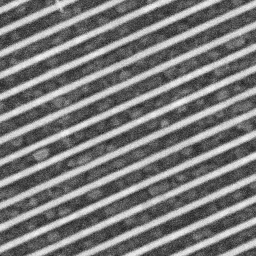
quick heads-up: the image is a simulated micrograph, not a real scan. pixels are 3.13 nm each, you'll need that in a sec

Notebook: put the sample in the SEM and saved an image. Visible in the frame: parallel lines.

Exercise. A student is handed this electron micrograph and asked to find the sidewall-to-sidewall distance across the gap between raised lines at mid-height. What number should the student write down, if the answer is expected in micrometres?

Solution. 0.048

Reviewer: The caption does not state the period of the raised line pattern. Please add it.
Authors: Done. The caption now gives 61.9 nm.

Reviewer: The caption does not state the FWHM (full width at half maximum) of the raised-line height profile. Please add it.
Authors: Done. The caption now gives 13.2 nm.